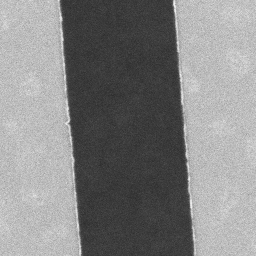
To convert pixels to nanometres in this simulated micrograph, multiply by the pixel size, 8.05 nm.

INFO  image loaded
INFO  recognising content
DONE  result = one or a few lines or trenches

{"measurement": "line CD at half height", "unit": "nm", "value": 934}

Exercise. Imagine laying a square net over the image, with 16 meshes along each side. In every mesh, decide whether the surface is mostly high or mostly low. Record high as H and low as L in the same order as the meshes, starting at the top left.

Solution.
LLLLHHHHHHHLLLLL
LLLLHHHHHHHLLLLL
LLLLHHHHHHHLLLLL
LLLLHHHHHHHLLLLL
LLLLHHHHHHHLLLLL
LLLLHHHHHHHLLLLL
LLLLHHHHHHHLLLLL
LLLLHHHHHHHHLLLL
LLLLHHHHHHHHLLLL
LLLLHHHHHHHHLLLL
LLLLLHHHHHHHLLLL
LLLLLHHHHHHHLLLL
LLLLLHHHHHHHLLLL
LLLLLHHHHHHHLLLL
LLLLLHHHHHHHLLLL
LLLLLHHHHHHHLLLL